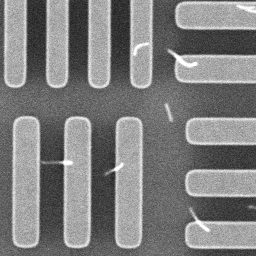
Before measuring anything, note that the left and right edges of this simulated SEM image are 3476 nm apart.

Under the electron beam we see groups of lines, slits or small figures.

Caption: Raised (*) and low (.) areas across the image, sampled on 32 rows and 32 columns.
.**...**...***..***...**********
.**...**...***..***...**********
.**...**...***..***...**********
.**...**...***..***....*********
.**...**...***..***.............
.**...**...***..***.............
.**...**...***..***.............
.**...**...***..***...**********
.**...**...***..***...**********
.**...**...***..***...**********
.**...**...**....**.............
................................
................................
................................
................................
..***...***....***.....*********
..***...***....***.....*********
..***...***....***.....*********
..***...***....***..............
..***...***....***..............
..***...***....***..............
..***...***...****......********
..***...***....***.....*********
..***...***....***.....*********
..***...***....***............*.
..***...***....***..............
..***...***....***..............
..***...***....***..............
..***...***....***.....*********
..***...***....***.....*********
..**....***....**......*********
................................